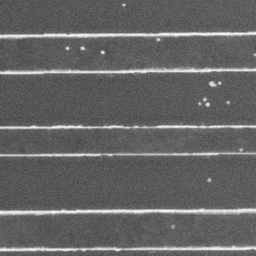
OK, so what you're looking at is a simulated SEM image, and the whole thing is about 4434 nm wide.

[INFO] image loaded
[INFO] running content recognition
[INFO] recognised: lines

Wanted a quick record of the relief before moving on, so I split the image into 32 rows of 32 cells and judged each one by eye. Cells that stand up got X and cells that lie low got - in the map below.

--------------------------------
--------------------------------
--------------------------------
--------------------------------
-XXXXXXXXXXXXXXXXXXXXXXXXXXXXXXX
XXXXXXXXXXXXXXXXXXXXXXXXXXXXXXXX
XXXXXXXXXXXXXXXXXXXXXXXXXXXXXXXX
XXXXXXXXXXXXXXXXXXXXXXXXXXXXXXXX
XXXXXXXXXXXXXXXXXXXXXXXXXXXXXXXX
--------------------------------
--------------------------------
--------------------------------
--------------------------------
--------------------------------
--------------------------------
--------------------------------
XXXXXXXXXXXXXXXXXXXXXXXXXXXXXXXX
XXXXXXXXXXXXXXXXXXXXXXXXXXXXXXXX
XXXXXXXXXXXXXXXXXXXXXXXXXXXXXXXX
--------------------------------
--------------------------------
--------------------------------
--------------------------------
--------------------------------
--------------------------------
--------------------------------
------XXXXXXXXXXXXXXXXXXXXXXXXXX
XXXXXXXXXXXXXXXXXXXXXXXXXXXXXXXX
XXXXXXXXXXXXXXXXXXXXXXXXXXXXXXXX
XXXXXXXXXXXXXXXXXXXXXXXXXXXXXXXX
XXXXXXXXXXXXXXXXXXXXXXXXXXXXXXXX
--------------------------------